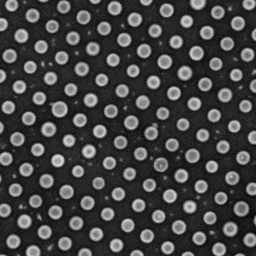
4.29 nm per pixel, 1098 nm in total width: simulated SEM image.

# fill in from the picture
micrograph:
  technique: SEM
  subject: a regular array of raised bodies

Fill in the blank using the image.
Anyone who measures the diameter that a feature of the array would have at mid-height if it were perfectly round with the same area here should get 0.0548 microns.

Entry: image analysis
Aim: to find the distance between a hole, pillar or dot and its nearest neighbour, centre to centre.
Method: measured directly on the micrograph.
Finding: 22.8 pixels